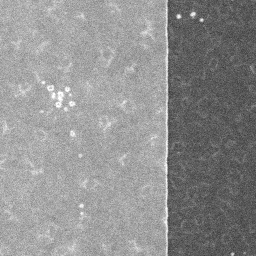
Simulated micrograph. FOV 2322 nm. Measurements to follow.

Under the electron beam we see one or a few lines or trenches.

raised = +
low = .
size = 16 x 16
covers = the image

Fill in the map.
++++++++++......
++++++++++......
++++++++++......
++++++++++......
++++++++++......
++++++++++......
++++++++++......
++++++++++......
++++++++++......
++++++++++......
++++++++++......
++++++++++......
++++++++++......
++++++++++......
++++++++++......
++++++++++......